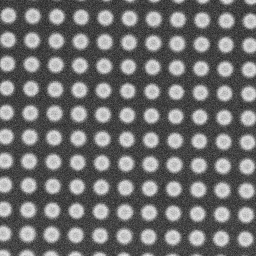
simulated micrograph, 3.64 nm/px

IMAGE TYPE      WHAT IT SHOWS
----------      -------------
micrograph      an array of small figures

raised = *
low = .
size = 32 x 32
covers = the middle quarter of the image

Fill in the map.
..****..****..****..****..****..
..****..****..****..****..****..
...............**....**....***..
................................
................................
..****..***....**....**....**...
..****..****..****..****..****..
..****..****..****..****..****..
...............**....**....**...
................................
................................
..***...***...***....**....**...
..****..****..****..****..****..
..****..***...****..****..****..
...*.....*.....**....**....**...
................................
................................
..***...***...***....**....**...
..****..***...****..****..****..
..***...***...****..****..****..
.........**....**...***...***...
................................
................................
..***...***...***...***....**...
..***...***...***...***...***...
..***...***...***...***...****..
.........**...***...***...***...
................................
................................
..***...***...***...**.....*....
.****..****...***...***...***...
..***...***...***..****...***...